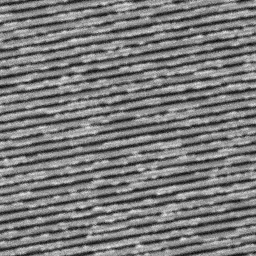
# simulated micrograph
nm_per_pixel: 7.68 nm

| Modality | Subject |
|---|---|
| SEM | parallel lines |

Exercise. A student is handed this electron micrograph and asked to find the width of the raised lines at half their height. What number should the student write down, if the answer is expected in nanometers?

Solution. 40.7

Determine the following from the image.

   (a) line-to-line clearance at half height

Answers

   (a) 26.5 nm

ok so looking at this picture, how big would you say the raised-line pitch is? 68.7 nm